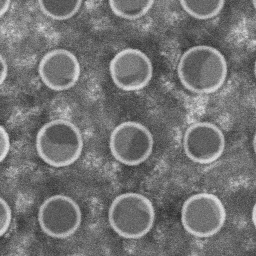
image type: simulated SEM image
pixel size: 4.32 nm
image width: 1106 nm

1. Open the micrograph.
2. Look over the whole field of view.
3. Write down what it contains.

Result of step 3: a regular array of raised bodies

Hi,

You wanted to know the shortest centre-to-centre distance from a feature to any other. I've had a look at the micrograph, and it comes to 71.4 px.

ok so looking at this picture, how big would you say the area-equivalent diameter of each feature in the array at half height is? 40.1 px